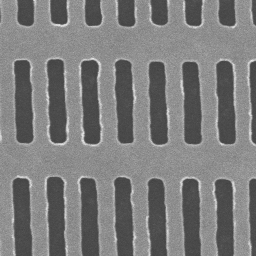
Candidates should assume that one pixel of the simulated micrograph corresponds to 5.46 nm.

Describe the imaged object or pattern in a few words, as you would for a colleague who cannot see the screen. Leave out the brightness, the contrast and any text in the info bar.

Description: holes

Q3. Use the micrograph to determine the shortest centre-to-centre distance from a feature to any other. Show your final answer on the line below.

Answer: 183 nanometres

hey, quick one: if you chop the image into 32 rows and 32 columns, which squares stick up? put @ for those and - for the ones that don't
@@--@@--@@@--@@--@@--@@--@@--@@-
@@--@@--@@@--@@--@@--@@--@@--@@@
@@--@@@-@@@--@@--@@--@@--@@--@@@
@@@@@@@@@@@@@@@@@@@@@@@@@@@@@@@@
@@@@@@@@@@@@@@@@@@@@@@@@@@@@@@@@
@@@@@@@@@@@@@@@@@@@@@@@@@@@@@@@@
@@@@@@@@@@@@@@@@@@@@@@@@@@@@@@@@
@@-@@@--@@@@@@@@@@@@@@@@@@@@@@@@
@@--@@--@@--@@--@@@--@@--@@--@@-
@@--@@--@@--@@--@@@--@@--@@--@@-
@@--@@--@@--@@---@@--@@--@@--@@-
@@--@@--@@--@@---@@--@@--@@--@@-
@@--@@--@@--@@---@@--@@--@@--@@-
@@--@@--@@--@@@--@@--@@--@@--@@-
@@--@@--@@--@@@--@@--@@--@@--@@-
@@--@@--@@--@@@--@@--@@--@@--@@-
@@--@@--@@---@@--@@--@@--@@--@@-
@@--@@--@@@-@@@--@@--@@--@@--@@-
@@@@@@@@@@@@@@@@@@@@@@@@@@@@@@@@
@@@@@@@@@@@@@@@@@@@@@@@@@@@@@@@@
@@@@@@@@@@@@@@@@@@@@@@@@@@@@@@@@
@@@@@@@@@@@@@@@@@@@@@@@@@@@@@@@@
@@-@@@--@@--@@--@@@-@@@-@@@-@@@@
@@--@@--@@--@@--@@---@@--@@--@@-
@@--@@--@@--@@--@@---@@--@@--@@-
@@--@@--@@--@@--@@@--@@--@@--@@-
@@--@@--@@--@@---@@--@@--@@--@@-
@@--@@--@@--@@---@@--@@--@@--@@-
@@--@@--@@--@@---@@--@@--@@--@@-
@@--@@--@@--@@@--@@--@@--@@--@@-
@@--@@--@@--@@@--@@--@@--@@--@@-
@@--@@--@@--@@@--@@--@@--@@--@@-